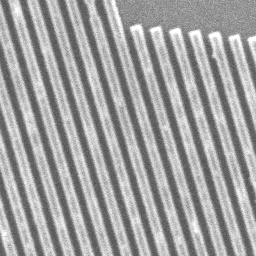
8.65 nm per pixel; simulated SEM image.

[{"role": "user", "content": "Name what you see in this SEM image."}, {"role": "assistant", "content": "parallel lines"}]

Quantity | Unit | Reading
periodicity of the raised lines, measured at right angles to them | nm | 158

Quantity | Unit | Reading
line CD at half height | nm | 75.7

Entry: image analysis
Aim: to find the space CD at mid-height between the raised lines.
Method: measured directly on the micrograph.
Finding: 75.7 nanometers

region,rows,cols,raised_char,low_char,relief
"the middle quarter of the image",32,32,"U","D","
UUUDDUUUDDUUDDDUUDDUUUDDUUUDDUUD
DUUDDDUUDDUUUDDUUDDDUUDDDUUDDUUU
DUUUDDUUDDDUUDDUUUDDUUUDDUUDDDUU
DUUUDDUUDDDUUDDDUUDDDUUDDUUUDDUU
DDUUDDUUUDDUUUDDUUDDDUUDDUUUDDUU
DDUUDDDUUDDDUUDDUUUDDUUDDDUUDDDU
DDUUUDDUUDDDUUDDDUUDDUUUDDUUDDDU
DDDUUDDUUUDDUUDDDUUDDDUUDDUUUDDU
UDDUUDDDUUDDUUUDDUUDDDUUDDDUUDDU
UDDUUUDDUUDDDUUDDDUUDDUUUDDUUDDD
UDDUUUDDUUDDDUUDDDUUDDDUUDDUUDDD
UDDDUUDDDUUDDUUUDDUUDDDUUDDUUUDD
UUDDUUDDDUUDDDUUDDUUUDDUUDDDUUDD
UUDDUUUDDUUDDDUUDDDUUDDDUUDDUUUD
UUDDDUUDDUUUDDUUDDDUUDDDUUDDUUUD
UUUDDUUDDDUUDDUUUDDUUUDDUUDDDUUD
UUUDDUUDDDUUDDDUUDDDUUDDUUUDDUUD
DUUDDUUUDDUUUDDUUDDDUUDDDUUDDUUU
DUUDDDUUDDDUUDDUUUDDUUDDDUUDDDUU
DUUUDDUUDDDUUDDDUUDDUUUDDUUUDDUU
DDUUDDUUUDDUUDDDUUDDDUUDDDUUDDUU
DDUUDDDUUDDDUUDDUUUDDUUDDDUUDDUU
DDUUUDDUUDDDUUDDDUUDDUUUDDUUDDDU
DDUUUDDUUUDDUUDDDUUDDUUUDDUUUDDU
DDDUUDDDUUDDUUUDDUUDDDUUDDDUUDDU
UDDUUUDDUUDDDUUDDUUUDDUUDDDUUDDD
UDDUUUDDUUDDDUUDDDUUDDDUUDDUUUDD
UDDDUUDDUUUDDUUDDDUUDDDUUDDDUUDD
UUDDUUDDDUUDDDUUDDUUUDDUUDDDUUDD
UUDDUUUDDUUDDDUUDDDUUDDUUUDDUUDD
UUDDDUUDDUUUDDUUDDDUUDDDUUDDDUUD
UUDDDUUDDDUUDDUUUDDUUDDDUUDDDUUD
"